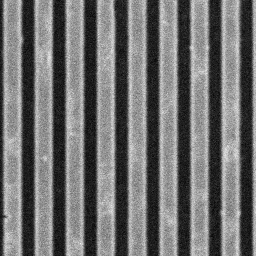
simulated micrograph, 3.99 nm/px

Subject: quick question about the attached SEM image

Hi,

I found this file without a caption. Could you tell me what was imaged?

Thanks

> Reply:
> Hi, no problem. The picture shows parallel lines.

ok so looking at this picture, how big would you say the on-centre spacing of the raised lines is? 124 nm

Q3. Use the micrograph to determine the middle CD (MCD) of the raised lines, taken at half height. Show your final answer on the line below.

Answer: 17.1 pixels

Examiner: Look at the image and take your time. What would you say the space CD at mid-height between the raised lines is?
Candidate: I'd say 57.3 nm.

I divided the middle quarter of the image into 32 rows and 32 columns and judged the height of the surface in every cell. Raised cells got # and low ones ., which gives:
.####...####....####....####....
.####...####....####....####....
.####...####....####....####....
.####...####....####....####....
.####...####....####....####....
.####...####....####....####....
.####...####....####....####....
.####...####....####....####....
.####...####....####....####....
.####...####....####....####....
.####...####....####....####....
.####...####....####....####....
.####...####....####....####....
.####...####....####....####....
.####...####....####....####....
.####...####....####....####....
.####...####....####....####....
.####...####....####....####....
.####...####....####....####....
.####...####....####....####....
.####...#####...####....####....
.####...#####...####....####....
.####...#####...####....####....
.####...#####...####....####....
.####...#####...####....####....
.####...#####...####....####....
.####...#####...####....####....
.####...#####...####....####....
.####...#####...####....####....
.####...#####...####....####....
.####...#####...####....####....
.####...#####...####....####....